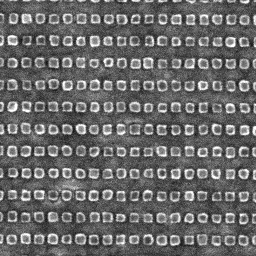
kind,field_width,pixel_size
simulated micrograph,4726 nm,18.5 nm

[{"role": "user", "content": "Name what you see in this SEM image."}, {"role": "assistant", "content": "a regular array of raised bodies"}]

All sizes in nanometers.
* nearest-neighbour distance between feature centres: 246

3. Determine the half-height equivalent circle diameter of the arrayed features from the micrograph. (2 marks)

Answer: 173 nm